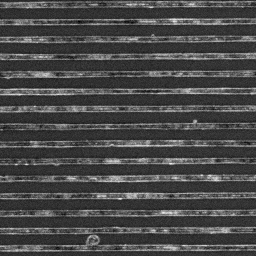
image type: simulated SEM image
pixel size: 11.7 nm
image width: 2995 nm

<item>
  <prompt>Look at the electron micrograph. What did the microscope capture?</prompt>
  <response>parallel lines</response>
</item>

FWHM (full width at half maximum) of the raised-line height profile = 0.0585 um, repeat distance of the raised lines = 204 nm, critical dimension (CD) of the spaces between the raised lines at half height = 142 nm